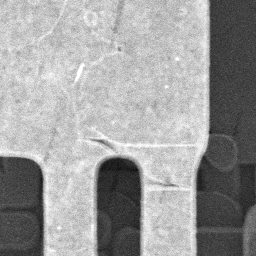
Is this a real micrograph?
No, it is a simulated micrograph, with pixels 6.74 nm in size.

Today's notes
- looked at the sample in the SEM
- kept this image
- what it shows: wiring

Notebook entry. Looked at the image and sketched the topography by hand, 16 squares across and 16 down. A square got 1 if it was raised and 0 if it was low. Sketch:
1111111111111000
1111111111111000
1111111111111000
1111111111111000
1111111111111000
1111111111111000
1111111111111000
1111111111111000
1111111111111000
1111111111111000
0001110001110000
0001110001110000
0001110001110000
0001110001110000
0001110001110001
0001110001110001